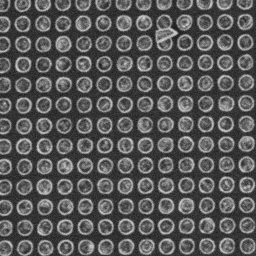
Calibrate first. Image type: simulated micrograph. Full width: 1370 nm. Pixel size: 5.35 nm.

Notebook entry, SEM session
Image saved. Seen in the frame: a regular array of raised bodies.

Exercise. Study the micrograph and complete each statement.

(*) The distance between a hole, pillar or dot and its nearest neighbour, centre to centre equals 0.107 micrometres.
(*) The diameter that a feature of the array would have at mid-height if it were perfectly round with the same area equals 14.6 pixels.